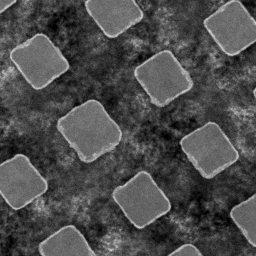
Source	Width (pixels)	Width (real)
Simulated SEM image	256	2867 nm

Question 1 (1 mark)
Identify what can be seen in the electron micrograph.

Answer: raised bodies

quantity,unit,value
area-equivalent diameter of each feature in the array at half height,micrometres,0.559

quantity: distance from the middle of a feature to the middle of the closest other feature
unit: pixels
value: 85.2